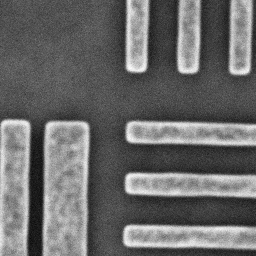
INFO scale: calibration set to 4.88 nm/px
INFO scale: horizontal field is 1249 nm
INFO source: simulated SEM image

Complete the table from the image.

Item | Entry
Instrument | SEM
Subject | groups of lines, slits or small figures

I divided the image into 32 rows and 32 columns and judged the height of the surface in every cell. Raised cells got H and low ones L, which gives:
LLLLLLLLLLLLLLLLHHLLLLHHHLLLLHHL
LLLLLLLLLLLLLLLLHHLLLLHHHLLLLHHL
LLLLLLLLLLLLLLLLHHLLLLHHHLLLLHHL
LLLLLLLLLLLLLLLLHHLLLLHHHLLLLHHL
LLLLLLLLLLLLLLLLHHLLLLHHHLLLLHHL
LLLLLLLLLLLLLLLLHHLLLLHHHLLLLHHL
LLLLLLLLLLLLLLLLHHLLLLHHHLLLLHHL
LLLLLLLLLLLLLLLLHHLLLLHHHLLLLHHL
LLLLLLLLLLLLLLLLHHLLLLHHHLLLLHHL
LLLLLLLLLLLLLLLLLLLLLLLLLLLLLLLL
LLLLLLLLLLLLLLLLLLLLLLLLLLLLLLLL
LLLLLLLLLLLLLLLLLLLLLLLLLLLLLLLL
LLLLLLLLLLLLLLLLLLLLLLLLLLLLLLLL
LLLLLLLLLLLLLLLLLLLLLLLLLLLLLLLL
LLLLLLLLLLLLLLLLLLLLLLLLLLLLLLLL
HHHHLLHHHHHLLLLLHHHHHHHHHHHHHHLL
HHHHLLHHHHHLLLLLHHHHHHHHHHHHHHHH
HHHHLLHHHHHLLLLLHHHHHHHHHHHHHHHH
HHHHLLHHHHHLLLLLLLLLLLLLLLLLLLLL
HHHHLLHHHHHLLLLLLLLLLLLLLLLLLLLL
HHHHLLHHHHHLLLLLLLLLLLLLLLLLLLLL
HHHHLLHHHHHLLLLLLLLLLLLLLLLLLLLL
HHHLLLHHHHHLLLLLHHHHHHHHHHHHHHHH
HHHLLLHHHHHLLLLLHHHHHHHHHHHHHHHH
HHHLLLHHHHHLLLLLLLLLLLLLLLLLLHHH
HHHLLLHHHHHLLLLLLLLLLLLLLLLLLLLL
HHHLLLHHHHHLLLLLLLLLLLLLLLLLLLLL
HHHLLLHHHHHLLLLLLLLLLLLLLLLLLLLL
HHHLLHHHHHHLLLLLHHHHHHHHHHHHHHHH
HHHLLHHHHHHLLLLLHHHHHHHHHHHHHHHH
HHHLLHHHHHHLLLLLHHHHHHHHHHHHHHHH
HHHLLHHHHHHLLLLLLLLLLLLLLLLLLLLL